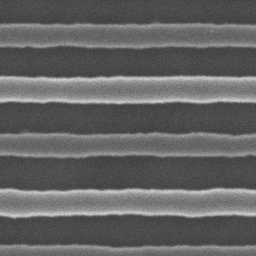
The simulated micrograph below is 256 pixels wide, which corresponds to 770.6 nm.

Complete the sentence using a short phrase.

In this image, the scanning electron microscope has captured lines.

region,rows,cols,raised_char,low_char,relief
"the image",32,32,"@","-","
--------------------------------
--------------------------------
--------------------------------
@@@@@@@@@@@@@@@@@@@@@@@@@@@@@@@@
@@@@@@@@@@@@@@@@@@@@@@@@@@@@@@@@
@@@@@@@@@@@@@@@@@@@@@@@@@@@@@@@@
--------------------------------
--------------------------------
--------------------------------
--------------------------------
@@@@@@@@@@@@@@@@@@@@@@@@@@@@@@@@
@@@@@@@@@@@@@@@@@@@@@@@@@@@@@@@@
@@@@@@@@@@@@@@@@@@@@@@@@@@@@@@@@
--------------------------------
--------------------------------
--------------------------------
--------------------------------
@@@@@@@@@@@@@@@@@@@@@@@@@@@@@@@@
@@@@@@@@@@@@@@@@@@@@@@@@@@@@@@@@
---@@@@@@@@---------@--------@--
--------------------------------
--------------------------------
--------------------------------
--------------------------------
@@@@@@@@@@@@@@@@@@@@@@@@@@@@@@@@
@@@@@@@@@@@@@@@@@@@@@@@@@@@@@@@@
@@@@@@@@@@@@@@@@@@@@@@@@@@@@@@@@
--------------------------------
--------------------------------
--------------------------------
--------------------------------
@@@@@@@@@@@@@@@@@@@@@@@@@@@@@@@@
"